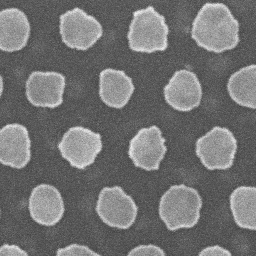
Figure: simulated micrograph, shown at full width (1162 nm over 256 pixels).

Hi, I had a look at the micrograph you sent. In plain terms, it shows a regular array of raised bodies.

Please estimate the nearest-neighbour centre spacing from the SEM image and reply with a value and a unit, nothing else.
303 nanometers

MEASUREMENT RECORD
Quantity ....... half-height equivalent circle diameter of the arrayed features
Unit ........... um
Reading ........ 0.177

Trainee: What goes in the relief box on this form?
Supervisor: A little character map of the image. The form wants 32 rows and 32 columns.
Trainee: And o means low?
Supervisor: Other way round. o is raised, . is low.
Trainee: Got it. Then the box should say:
................................
ooo......o.......oo......oooo...
ooo.....oooo.....ooo....ooooo...
oooo....ooooo...ooooo...oooooo..
oooo....oooo....ooooo...oooooo..
ooo.....oooo....ooooo....oooo...
................................
................................
...............................o
....oooo.....ooo......oo.....ooo
...ooooo....ooooo....oooo....ooo
...ooooo....ooooo....oooo....ooo
....oooo.....ooo.....oooo....ooo
......................oo........
................................
................................
ooo.....ooo......ooo......ooo...
oooo....ooooo....ooo.....oooo...
oooo....ooooo...ooooo....oooo...
oooo....oooo....oooo.....oooo...
.oo......oo......ooo......ooo...
................................
................................
....ooo.......o......ooo......oo
....oooo....oooo....ooooo....ooo
...ooooo....ooooo...ooooo....ooo
....oooo....ooooo...ooooo....ooo
....ooo......oooo...ooooo.....oo
.....................o.........o
................................
................................
ooo....oooo.....oooo.....ooo....